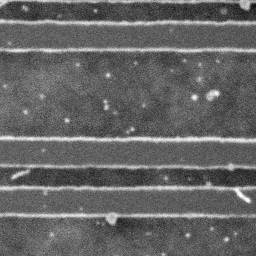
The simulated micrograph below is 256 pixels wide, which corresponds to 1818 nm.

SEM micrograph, lines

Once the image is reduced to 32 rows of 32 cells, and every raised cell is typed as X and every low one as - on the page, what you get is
------------------------------X-
--------------------------------
--------------------------------
XXXXXXXXXXXXXXXXXXXXXXXXXXXXXXXX
XXXXXXXXXXXXXXXXXXXXXXXXXXXXXXXX
XXXXXXXXXXXXXXXXXXXXXXXXXXXXXXXX
--------------------------------
--------------------------------
--------------------------------
--------------------------------
--------------------------------
--------------------------------
--------------------------------
--------------------------------
--------------------------------
--------------------------------
--------------------------------
XXXXXXXXXXXXXXXXXXXXXXXXXXXXX---
XXXXXXXXXXXXXXXXXXXXXXXXXXXXXXXX
XXXXXXXXXXXXXXXXXXXXXXXXXXXXXXXX
XXXXXXXXXXXXXXXXXXXXXXXXXXXXXXXX
--------------------------------
--------------------------------
--XXXX-XXX-------XXXXXX-XXX----X
XXXXXXXXXXXXXXXXXXXXXXXXXXXXXXXX
XXXXXXXXXXXXXXXXXXXXXXXXXXXXXXXX
XXXXXXXXXXXXXXXXXXXXXXXXXXXXXXXX
-------------X------------------
--------------------------------
--------------------------------
--------------------------------
--------------------------------